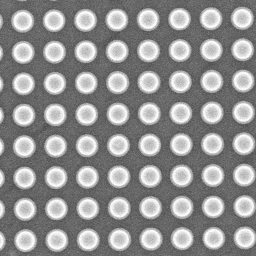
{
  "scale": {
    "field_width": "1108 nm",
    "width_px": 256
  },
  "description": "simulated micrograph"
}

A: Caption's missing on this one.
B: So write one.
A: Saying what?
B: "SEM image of an array of small figures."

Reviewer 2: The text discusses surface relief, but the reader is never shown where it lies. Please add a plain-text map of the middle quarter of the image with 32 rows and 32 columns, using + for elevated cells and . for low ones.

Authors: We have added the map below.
................................
................................
....+++.....+++....++++....++++.
...+++++...+++++...+++++..++++++
+..+++++...+++++...+++++..++++++
...+++++...+++++...+++++..++++++
...+++++...+++++...++++....++++.
.....+..........................
................................
................................
....+++.....+++....++++....++++.
...+++++...+++++...+++++..++++++
+..+++++...+++++...+++++..++++++
+..+++++...+++++...+++++...+++++
....++++....++++...++++....++++.
................................
................................
............................++..
....++++...+++++...+++++...+++++
...+++++...+++++...+++++...+++++
+..+++++...+++++...+++++...+++++
+..+++++...+++++...+++++...+++++
....++++....+++.....+++.....+++.
................................
................................
.............++.....+++.....+++.
....++++...+++++...+++++...+++++
+..++++++..+++++...+++++...+++++
+..++++++..+++++...+++++...+++++
+..+++++...+++++...+++++...+++++
....++++....+++.....+++.....+++.
................................